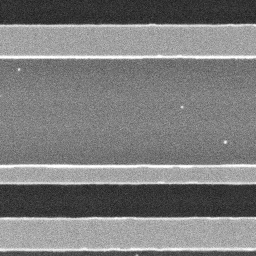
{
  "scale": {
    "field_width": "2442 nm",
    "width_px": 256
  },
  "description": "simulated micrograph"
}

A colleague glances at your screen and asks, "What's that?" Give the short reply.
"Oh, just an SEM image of lines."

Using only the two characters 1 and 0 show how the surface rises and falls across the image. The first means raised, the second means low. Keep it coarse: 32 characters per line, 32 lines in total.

00000000000000000000000000000000
00000000000000000000000000000000
00000000000000000000000000000000
11111111111111111111111111111111
11111111111111111111111111111111
11111111111111111111111111111111
11111111111111111111111111111111
00000000000000000000000000000000
00000000000000000000000000000000
00000000000000000000000000000000
00000000000000000000000000000000
00000000000000000000000000000000
00000000000000000000000000000000
00000000000000000000000000000000
00000000000000000000000000000000
00000000000000000000000000000000
00000000000000000000000000000000
00000000000000000000000000000000
00000000000000000000000000000000
00000000000000000000000000000000
00000000000000000000000000000000
11111111111111111111111111111111
11111111111111111111111111111111
00000000000000000000000000000000
00000000000000000000000000000000
00000000000000000000000000000000
00000000000000000000000000000000
11111111111111111111111111111111
11111111111111111111111111111111
11111111111111111111111111111111
11111111111111111111111111111111
00000000000000000000000000000000